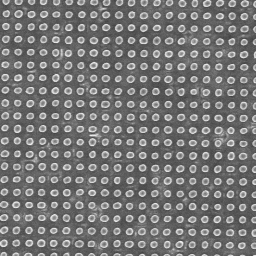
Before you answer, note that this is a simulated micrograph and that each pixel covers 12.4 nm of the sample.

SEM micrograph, a regular array of raised bodies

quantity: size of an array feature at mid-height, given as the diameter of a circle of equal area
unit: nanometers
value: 86.2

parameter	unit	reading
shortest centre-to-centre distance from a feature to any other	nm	152